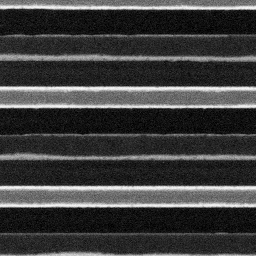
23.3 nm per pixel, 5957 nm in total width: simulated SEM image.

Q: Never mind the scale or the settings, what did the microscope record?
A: lines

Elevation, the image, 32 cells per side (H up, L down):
HHHHHHHHHHHHHHHHHHHHHHHHHHHHHHHH
LLLLLLLLLLLLLLLLLLLLLLLLLLLLLLLL
LLLLLLLLLLLLLLLLLLLLLLLLLLLLLLLL
LLLLLLLLLLLLLLLLLLLLLLLLLLLLLLLL
HHHHHHHHHHHHHHHHHHHHHHHHHHHHHHHH
HHHHHHHHHHHHHHHHHHHHHHHHHHHHHHHH
HHHHHHHHHHHHHHHHHHHHHHHHHHHHHHHH
LLLLLLLLLLLLLLLLLLLLLLLLLLLLLLLL
LLLLLLLLLLLLLLLLLLLLLLLLLLLLLLLL
LLLLLLLLLLLLLLLLLLLLLLLLLLLLLLLL
LLLLLLLLLLLLLLLLLLLLLLLLLLLLLLLL
HHHHHHHHHHHHHHHHHHHHHHHHHHHHHHHH
HHHHHHHHHHHHHHHHHHHHHHHHHHHHHHHH
LLLLLLLLLLLLLLLLLLLLLLLLLLLLLLLL
LLLLLLLLLLLLLLLLLLLLLLLLLLLLLLLL
LLLLLLLLLLLLLLLLLLLLLLLLLLLLLLLL
LLLLLLLLLLLLLLLLLLLLLLLLLLLLLLLL
HHHHHHHHHHHHHHHHHHHHHHHHHHHHHHHH
HHHHHHHHHHHHHHHHHHHHHHHHHHHHHHHH
HHHHHHHHHHHHHHHHHHHHHHHHHHHHHHHH
LLLLLLLLLLLLLLLLLLLLLLLLLLLLLLLL
LLLLLLLLLLLLLLLLLLLLLLLLLLLLLLLL
LLLLLLLLLLLLLLLLLLLLLLLLLLLLLLLL
HHHHHHHHHHHHHHHHHHHHHHHHHHHHHHHH
HHHHHHHHHHHHHHHHHHHHHHHHHHHHHHHH
HHHHHHHHHHHHHHHHHHHHHHHHHHHHHHHH
LLLLLLLLLLLLLLLLLLLLLLLLLLLLLLLL
LLLLLLLLLLLLLLLLLLLLLLLLLLLLLLLL
LLLLLLLLLLLLLLLLLLLLLLLLLLLLLLLL
HHHHHHHHHHHHHHHHHHHHHHHHHHHHHHHH
HHHHHHHHHHHHHHHHHHHHHHHHHHHHHHHH
HHHHHHHHHHHHHHHHHHHHHHHHHHHHHHHH